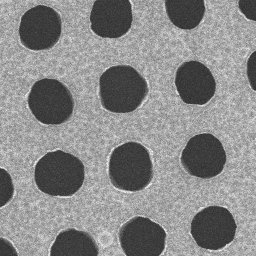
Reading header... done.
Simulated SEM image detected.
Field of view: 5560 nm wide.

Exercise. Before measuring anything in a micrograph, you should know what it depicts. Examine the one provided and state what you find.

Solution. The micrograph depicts a regular array of holes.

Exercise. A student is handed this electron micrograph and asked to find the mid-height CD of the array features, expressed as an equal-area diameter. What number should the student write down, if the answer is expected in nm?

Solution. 978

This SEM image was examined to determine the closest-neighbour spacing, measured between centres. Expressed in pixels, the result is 72.4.